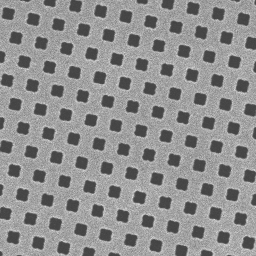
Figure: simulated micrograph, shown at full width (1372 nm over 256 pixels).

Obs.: a regular array of holes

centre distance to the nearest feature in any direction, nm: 135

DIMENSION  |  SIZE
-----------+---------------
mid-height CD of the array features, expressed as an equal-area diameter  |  0.0695 microns